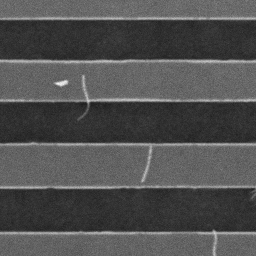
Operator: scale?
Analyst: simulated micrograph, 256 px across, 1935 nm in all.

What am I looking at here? lines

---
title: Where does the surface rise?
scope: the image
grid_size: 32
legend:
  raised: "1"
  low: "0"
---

11111111111111111111111111111111
11111111111111111111111111111111
00000000000000000000000000000000
00000000000000000000000000000000
00000000000000000000000000000000
00000000000000000000000000000000
00000000000000000000000000000000
00000000000000000000000000000000
11111111111111111111111111111111
11111111111111111111111111111111
11111111111111111111111111111111
11111111111111111111111111111111
11111111111111111111111111111111
00000000000000000000000000000000
00000000000000000000000000000000
00000000000000000000000000000000
00000000000000000000000000000000
00000000000000000000000000000000
11111111111111111111111111111111
11111111111111111111111111111111
11111111111111111111111111111111
11111111111111111111111111111111
11111111111111111111111111111111
11111111111111100100000010000000
00000000000000000000000000000000
00000000000000000000000000000000
00000000000000000000000000000000
00000000000000000000000000000000
00000000000000000000000000000000
11111111111111111111111111111111
11111111111111111111111111111111
11111111111111111111111111111111